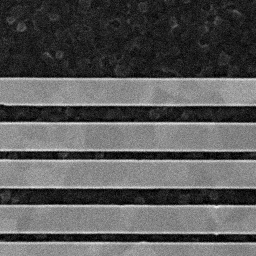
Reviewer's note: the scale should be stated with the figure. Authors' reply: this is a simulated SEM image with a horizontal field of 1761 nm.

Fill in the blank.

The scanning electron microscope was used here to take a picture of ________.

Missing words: parallel lines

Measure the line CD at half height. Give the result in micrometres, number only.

0.192